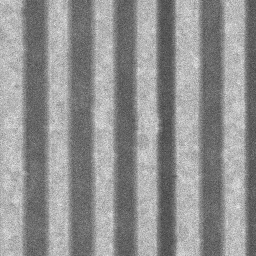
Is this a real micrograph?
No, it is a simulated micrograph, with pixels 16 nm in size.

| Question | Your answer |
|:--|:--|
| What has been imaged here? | parallel lines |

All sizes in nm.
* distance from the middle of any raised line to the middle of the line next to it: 703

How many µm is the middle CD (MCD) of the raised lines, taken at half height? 0.349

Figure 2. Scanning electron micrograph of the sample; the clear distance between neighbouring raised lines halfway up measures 379 nm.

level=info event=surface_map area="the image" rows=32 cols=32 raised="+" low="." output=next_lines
+++...+++...++...+++..+++...+++.
+++...+++...++...+++..+++...+++.
+++...+++...++...+++..+++...+++.
+++...+++...++...+++..+++...+++.
+++...+++...++...+++..+++...+++.
+++...+++...++...+++..+++...+++.
+++...+++...++...+++..+++...+++.
+++...+++...++...+++..+++...+++.
+++...+++...++...+++..+++...+++.
+++...+++...++...+++..+++...+++.
+++...+++...++...+++..+++...+++.
+++...+++...++...+++..+++...+++.
+++...+++...++...+++..+++...+++.
+++...+++...++...+++..+++...+++.
+++...+++...++...+++..+++...+++.
+++...+++...++...+++..+++...+++.
+++...+++...++...+++..+++...+++.
+++...+++...++...+++..+++...+++.
+++...+++...++...+++..+++...+++.
+++...+++...++...+++..+++...+++.
+++...+++...++...+++..+++...+++.
+++...+++...++...+++..+++...+++.
+++...+++...++...+++..+++...+++.
+++...+++...++...+++..+++...+++.
+++...+++...++...+++..+++...+++.
+++...+++...++...+++..+++...+++.
+++...+++...++...+++..+++...+++.
+++...+++...++...+++..+++...+++.
+++...+++...++...+++..+++...+++.
+++...+++...++...+++..+++...+++.
+++...+++...++...+++..+++...+++.
+++...+++...++...+++..+++...+++.